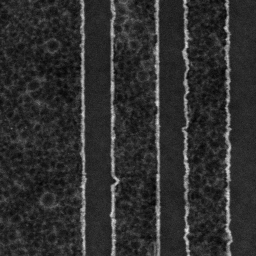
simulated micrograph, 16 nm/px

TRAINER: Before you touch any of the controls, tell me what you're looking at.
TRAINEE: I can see one or a few lines or trenches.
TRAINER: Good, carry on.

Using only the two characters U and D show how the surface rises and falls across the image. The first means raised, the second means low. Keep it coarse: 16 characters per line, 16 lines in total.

UUUUUDDUUUDDUUDD
UUUUUDDUUUDDUUDD
UUUUUDDUUUDDUUDD
UUUUUDDUUUDDUUDD
UUUUUDDUUUDDUUDD
UUUUUDDUUUDDUUDD
UUUUUDDUUUDDUUDD
UUUUUDDUUUDDUUDD
UUUUUDDUUUDDUUDD
UUUUUDDUUUDDUUDD
UUUUUDDUUUDDUUDD
UUUUUDDUUUDDUUDD
UUUUUDDUUUDDUUDD
UUUUUDDUUUDDUUDD
UUUUUDDUUUDDUUDD
UUUUUDDUUUDDUUDD